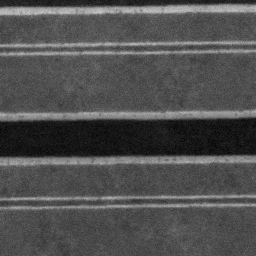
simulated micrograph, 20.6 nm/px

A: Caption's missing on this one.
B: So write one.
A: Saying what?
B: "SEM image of lines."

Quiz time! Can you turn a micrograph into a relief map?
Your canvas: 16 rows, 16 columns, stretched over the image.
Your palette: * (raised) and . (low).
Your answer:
................
****************
****************
****************
****************
****************
****************
................
................
................
****************
****************
****************
****************
****************
****************